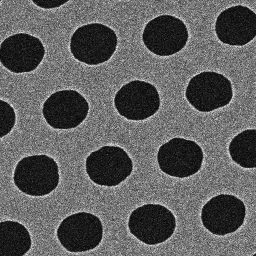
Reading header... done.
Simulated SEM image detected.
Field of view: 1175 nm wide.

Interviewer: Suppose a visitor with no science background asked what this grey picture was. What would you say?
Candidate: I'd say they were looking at a regular array of holes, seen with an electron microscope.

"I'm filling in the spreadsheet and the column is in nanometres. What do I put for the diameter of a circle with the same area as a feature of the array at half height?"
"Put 197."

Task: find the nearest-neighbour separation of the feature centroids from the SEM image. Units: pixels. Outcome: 71.4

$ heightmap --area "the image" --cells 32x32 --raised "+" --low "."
++++....++++++++++++++++++++++++
++++++++++++++++++++++++++++....
+++++++++++++++++++...+++++.....
++++++++++....++++.....++++.....
+...+++++......+++......+++.....
.....++++......+++.....+++++...+
......+++.....+++++...++++++++++
.....+++++...+++++++++++++++++++
+...++++++++++++++++++++++++++++
++++++++++++++++++++++++....++++
++++++++++++++++...+++++.....+++
+++++++...+++++.....+++......+++
++++++.....+++......+++......+++
..+++......++++.....++++...+++++
..+++......++++....+++++++++++++
..++++....++++++++++++++++++++++
.+++++++++++++++++++++++++++++..
+++++++++++++++++++++...+++++...
+++++++++++++..+++++.....++++...
++++..+++++.....++++.....++++...
++.....++++......+++.....+++++..
++.....++++.....++++.....+++++++
++.....++++....+++++++++++++++++
++.....+++++++++++++++++++++++++
+++++++++++++++++++++++++++..+++
++++++++++++++++++++++++++....++
+++++++++++++++++....++++......+
++++++++....++++......+++......+
...++++......+++......++++....++
....+++......++++....+++++++++++
....++++....++++++..++++++++++++
...+++++++++++++++++++++++++++++